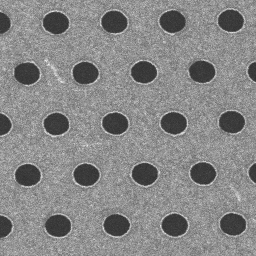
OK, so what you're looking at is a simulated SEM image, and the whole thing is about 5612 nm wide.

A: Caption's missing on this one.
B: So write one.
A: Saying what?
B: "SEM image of a regular array of holes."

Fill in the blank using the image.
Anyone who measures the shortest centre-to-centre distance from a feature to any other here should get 1280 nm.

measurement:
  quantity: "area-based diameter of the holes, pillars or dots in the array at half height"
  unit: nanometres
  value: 538